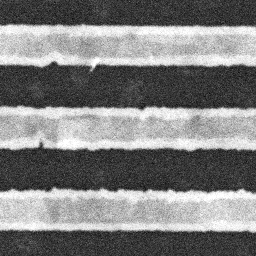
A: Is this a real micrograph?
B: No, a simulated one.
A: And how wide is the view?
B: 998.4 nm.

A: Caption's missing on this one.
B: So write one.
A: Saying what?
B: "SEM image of one or a few lines or trenches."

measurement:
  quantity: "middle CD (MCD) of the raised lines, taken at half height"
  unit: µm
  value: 0.126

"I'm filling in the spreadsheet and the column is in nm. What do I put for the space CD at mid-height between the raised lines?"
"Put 194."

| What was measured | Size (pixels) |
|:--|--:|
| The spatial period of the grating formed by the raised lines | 82.3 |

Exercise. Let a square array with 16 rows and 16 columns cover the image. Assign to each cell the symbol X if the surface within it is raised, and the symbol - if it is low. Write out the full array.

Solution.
----------------
----------------
XXXXXXXXXXXXXXXX
XXXXXXXXXXXXXXXX
----------------
----------------
----------------
XXXXXXXXXXXXXXXX
XXXXXXXXXXXXXXXX
----------------
----------------
----------------
XXXXXXXXXXXXXXXX
XXXXXXXXXXXXXXXX
----------------
----------------